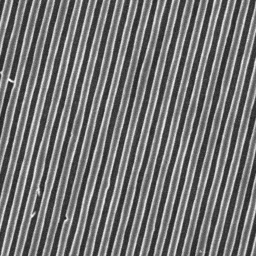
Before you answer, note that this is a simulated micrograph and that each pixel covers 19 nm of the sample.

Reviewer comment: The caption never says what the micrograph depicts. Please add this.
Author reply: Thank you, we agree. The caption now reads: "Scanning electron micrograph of parallel lines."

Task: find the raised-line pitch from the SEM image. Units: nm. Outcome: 257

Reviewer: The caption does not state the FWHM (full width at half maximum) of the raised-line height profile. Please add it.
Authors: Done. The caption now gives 6.57 pixels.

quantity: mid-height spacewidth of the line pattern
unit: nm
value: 122